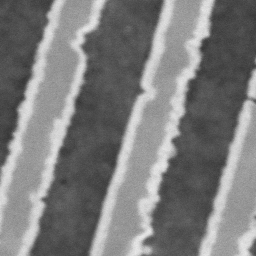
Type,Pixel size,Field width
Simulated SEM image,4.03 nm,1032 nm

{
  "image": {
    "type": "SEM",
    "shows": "one or a few lines or trenches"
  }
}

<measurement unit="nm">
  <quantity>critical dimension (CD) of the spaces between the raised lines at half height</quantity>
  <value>262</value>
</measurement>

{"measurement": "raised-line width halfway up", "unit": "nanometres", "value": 165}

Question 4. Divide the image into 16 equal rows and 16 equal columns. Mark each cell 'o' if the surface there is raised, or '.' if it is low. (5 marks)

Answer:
...ooo....ooo...
...ooo....ooo...
...oo.....oo....
...oo.....oo....
..ooo....ooo....
..ooo....oo.....
..oo.....oo.....
.ooo....ooo....o
.ooo....ooo....o
.ooo....oo.....o
ooo.....oo....oo
ooo....ooo....oo
ooo....oo.....oo
oo.....oo....ooo
oo....ooo....ooo
oo....ooo....ooo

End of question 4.